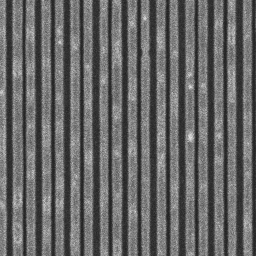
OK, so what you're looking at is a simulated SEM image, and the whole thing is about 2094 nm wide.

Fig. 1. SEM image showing parallel lines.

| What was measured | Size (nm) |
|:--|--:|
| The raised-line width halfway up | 74.6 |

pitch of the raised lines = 118 nanometres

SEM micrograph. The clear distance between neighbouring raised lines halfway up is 0.0521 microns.